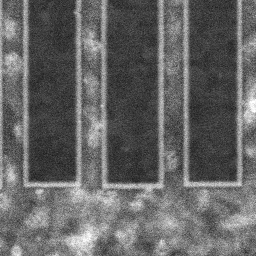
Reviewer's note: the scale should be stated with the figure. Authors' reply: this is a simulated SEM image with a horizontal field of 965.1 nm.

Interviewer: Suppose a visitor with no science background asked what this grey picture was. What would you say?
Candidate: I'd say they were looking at one or a few lines or trenches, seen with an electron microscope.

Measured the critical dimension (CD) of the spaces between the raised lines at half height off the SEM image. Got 92.8 nm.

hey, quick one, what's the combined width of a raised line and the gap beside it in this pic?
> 303 nm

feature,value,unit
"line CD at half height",204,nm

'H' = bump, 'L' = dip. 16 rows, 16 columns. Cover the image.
LLHHHLHHHHLLHHHL
LLHHHLHHHHLLHHHL
LLHHHLHHHHLLHHHL
LLHHHLLHHHLLHHHL
LLHHHLLHHHLLHHHL
LLHHHLLHHHLLHHHL
LLHHHLHHHHLLHHHL
LLHHHLLHHHLLHHHL
LLHHHLLHHHLLHHHL
LLHHHLLHHHLLHHHL
LLHHHLLHHHLLHHHL
LLHHHLLHHHLLHHHL
LLLLLLLLLLLLLLLL
LLLLLLLLLLLLLLLL
LLLLLLLLLLLLLLLL
LLLLLLLLLLLLLLLL